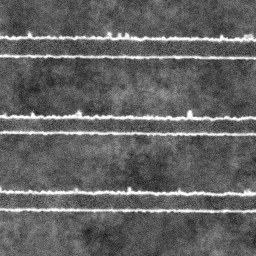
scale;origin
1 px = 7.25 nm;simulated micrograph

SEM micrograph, lines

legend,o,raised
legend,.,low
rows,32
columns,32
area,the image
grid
................................
................................
................................
................................
.............o..................
oooooooooooooooooooooooooooooooo
oooooooooooooooooooooooooooooooo
................................
................................
................................
................................
................................
................................
................................
.o..o.o.oo.............o........
oooooooooooooooooooooooooooooooo
oooooooooooooooooooooooooooooooo
................................
................................
................................
................................
................................
................................
................................
oooooooooooooooooooooooooooooooo
oooooooooooooooooooooooooooooooo
..........................oo..o.
................................
................................
................................
................................
................................